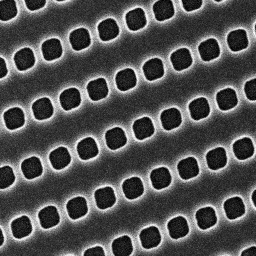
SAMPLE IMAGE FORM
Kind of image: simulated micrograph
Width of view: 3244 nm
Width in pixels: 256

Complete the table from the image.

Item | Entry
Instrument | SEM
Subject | a regular array of holes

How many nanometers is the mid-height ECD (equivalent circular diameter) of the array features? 287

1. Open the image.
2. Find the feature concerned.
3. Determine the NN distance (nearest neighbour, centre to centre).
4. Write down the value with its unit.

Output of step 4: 372 nm